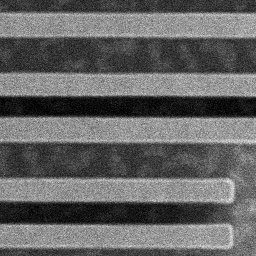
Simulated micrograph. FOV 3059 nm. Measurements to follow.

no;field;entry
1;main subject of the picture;parallel lines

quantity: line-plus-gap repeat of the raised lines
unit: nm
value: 630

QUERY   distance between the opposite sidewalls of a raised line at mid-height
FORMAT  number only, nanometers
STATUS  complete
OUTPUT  285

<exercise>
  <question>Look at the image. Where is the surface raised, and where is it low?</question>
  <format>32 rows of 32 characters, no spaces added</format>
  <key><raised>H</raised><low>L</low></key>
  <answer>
LLLLLLLLLLLLLLLLLLLLLLLLLLLLLLLL
LLLLLLLLLLLLLLLLLLLLLLLLLLLLLLLL
HHHHHHHHHHHHHHHHHHHHHHHHHHHHHHHH
HHHHHHHHHHHHHHHHHHHHHHHHHHHHHHHH
HHHHHHHHHHHHHHHHHHHHHHHHHHHHHHHH
LLLLLLLLLLLLLLLLLLLLLLLLLLLLLLLL
LLLLLLLLLLLLLLLLLLLLLLLLLLLLLLLL
LLLLLLLLLLLLLLLLLLLLLLLLLLLLLLLL
LLLLLLLLLLLLLLLLLLLLLLLLLLLLLLLL
HHHHHHHHHHHHHHHHHHHHHHHHHHHHHHHH
HHHHHHHHHHHHHHHHHHHHHHHHHHHHHHHH
HHHHHHHHHHHHHHHHHHHHHHHHHHHHHHHH
LLLLLLLLLLLLLLLLLLLLLLLLLLLLLLLL
LLLLLLLLLLLLLLLLLLLLLLLLLLLLLLLL
LLLLLLLLLLLLLLLLLLLLLLLLLLLLLLLL
HHHHHHHHHHHHHHHHHHHHHHHHHHHHHHHH
HHHHHHHHHHHHHHHHHHHHHHHHHHHHHHHH
HHHHHHHHHHHHHHHHHHHHHHHHHHHHHHHH
LLLLLLLLLLLLLLLLLLLLLLLLLLLLLLLL
LLLLLLLLLLLLLLLLLLLLLLLLLLLLLLLL
LLLLLLLLLLLLLLLLLLLLLLLLLLLLLLLL
LLLLLLLLLLLLLLLLLLLLLLLLLLLLLLLL
HHHHHHHHHHHHHHHHHHHHHHHHLHHHHLLL
HHHHHHHHHHHHHHHHHHHHHHHHHHHHHLLL
HHHHHHHHHHHHHHHHHHHHHHHHHHHHHLLL
LLLLLLLLLLLLLLLLLLLLLLLLLLLLLLLL
LLLLLLLLLLLLLLLLLLLLLLLLLLLLLLLL
LLLLLLLLLLLLLLLLLLLLLLLLLLLLLLLL
HHHHHHHHHHHHHHHHHHHHHHHHHHHHHLLL
HHHHHHHHHHHHHHHHHHHHHHHHHHHHHLLL
HHHHHHHHHHHHHHHHHHHHHHHHHHHHHLLL
LLLLLLLLLLLLLLLLLLLLLLLLLLLLLLLL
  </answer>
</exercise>